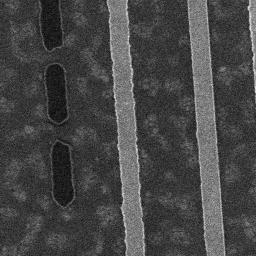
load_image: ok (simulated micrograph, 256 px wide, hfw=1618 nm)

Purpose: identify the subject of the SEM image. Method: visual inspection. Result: one or a few lines or trenches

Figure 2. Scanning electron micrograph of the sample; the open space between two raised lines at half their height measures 358 nm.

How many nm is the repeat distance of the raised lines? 473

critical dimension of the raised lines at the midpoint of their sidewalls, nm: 117